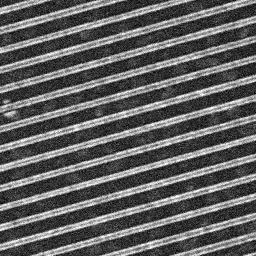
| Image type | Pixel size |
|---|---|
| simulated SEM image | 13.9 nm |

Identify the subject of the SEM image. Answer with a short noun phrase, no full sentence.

parallel lines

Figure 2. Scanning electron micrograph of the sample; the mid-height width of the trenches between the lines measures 0.203 µm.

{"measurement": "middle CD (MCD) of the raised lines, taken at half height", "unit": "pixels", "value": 4.58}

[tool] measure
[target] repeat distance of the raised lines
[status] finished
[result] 0.264 um